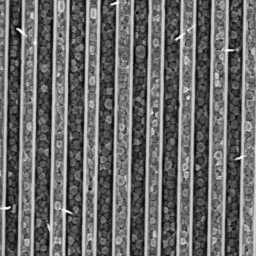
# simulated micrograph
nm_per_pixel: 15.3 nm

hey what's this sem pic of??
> parallel lines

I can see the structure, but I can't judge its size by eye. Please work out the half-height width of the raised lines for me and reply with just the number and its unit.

0.21 micrometres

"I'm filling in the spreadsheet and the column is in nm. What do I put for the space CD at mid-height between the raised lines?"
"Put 269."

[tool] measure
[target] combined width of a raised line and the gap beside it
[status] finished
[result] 31.7 px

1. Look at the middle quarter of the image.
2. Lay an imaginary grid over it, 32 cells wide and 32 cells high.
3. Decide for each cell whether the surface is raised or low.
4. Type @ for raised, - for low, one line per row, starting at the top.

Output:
@-----@@-----@@@@----@@@@----@@@
@----@@@-----@@@@----@@@@----@@@
@----@@@-----@@@@----@@@@----@@@
@----@@@-----@@@@----@@@@----@@@
@----@@@-----@@@@----@@@@----@@@
@----@@@-----@@@@----@@@@----@@@
@-----@@-----@@@@----@@@@----@@@
@-----@@-----@@@@----@@@@----@@@
------@@-----@@@@----@@@@----@@@
@-----@@-----@@@@----@@@-----@@@
------@@-----@@@@----@@@-----@@@
------@@-----@@@@----@@@-----@@@
------@@-----@@@@----@@@-----@@@
------@@-----@@@@----@@@-----@@@
------@@-----@@@@----@@@-----@@@
-----@@@-----@@@@----@@@-----@@@
-----@@@-----@@@@----@@@-----@@@
@----@@@-----@@@@----@@@-----@@@
@----@@@-----@@@-----@@@-----@@@
@----@@@-----@@@-----@@@-----@@@
@----@@@-----@@@-----@@@-----@@@
-----@@@-----@@@-----@@@-----@@@
-----@@@-----@@@-----@@@-----@@@
-----@@@-----@@@-----@@@-----@@@
-----@@@-----@@@-----@@@-----@@@
-----@@@-----@@@-----@@@-----@@@
-----@@@-----@@@-----@@@-----@@@
-----@@@-----@@@-----@@@-----@@@
-----@@@-----@@@-----@@@-----@@@
-----@@@-----@@@-----@@@-----@@@
-----@@@-----@@@-----@@@-----@@@
-----@@@-----@@@-----@@@-----@@@